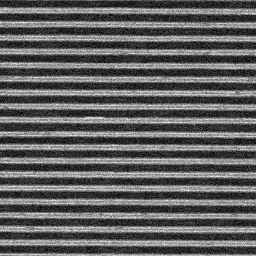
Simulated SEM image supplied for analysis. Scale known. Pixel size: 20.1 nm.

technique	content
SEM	parallel lines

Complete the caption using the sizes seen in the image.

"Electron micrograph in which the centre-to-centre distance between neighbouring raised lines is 274 nanometres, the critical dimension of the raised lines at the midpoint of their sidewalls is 103 nanometres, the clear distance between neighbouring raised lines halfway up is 176 nm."